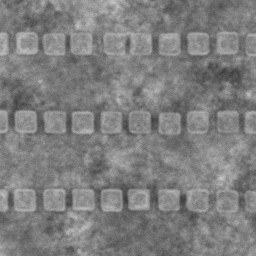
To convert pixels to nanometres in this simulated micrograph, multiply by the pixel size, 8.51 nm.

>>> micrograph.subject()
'a regular array of raised bodies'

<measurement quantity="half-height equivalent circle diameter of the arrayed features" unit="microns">0.195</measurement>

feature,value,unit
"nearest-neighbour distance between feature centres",241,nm